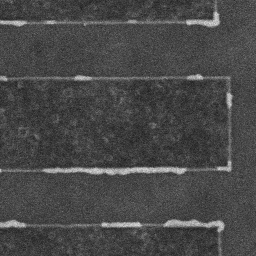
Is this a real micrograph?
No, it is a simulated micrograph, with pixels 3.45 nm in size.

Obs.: one or a few lines or trenches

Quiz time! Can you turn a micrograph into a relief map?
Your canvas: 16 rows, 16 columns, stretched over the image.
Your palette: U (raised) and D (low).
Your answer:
UUUUUUUUUUUUUUDD
UUDDDDDDDDDDUDDD
DDDDDDDDDDDDDDDD
DDDDDDDDDDDDDDDD
DDDDDDDDDDDDDDDD
UUUUUUUUUUUUUUDD
UUUUUUUUUUUUUUDD
UUUUUUUUUUUUUUDD
UUUUUUUUUUUUUUDD
UUUUUUUUUUUUUUDD
UUUUUUUUUUUUUUDD
DDDDDDDDDDDDDDDD
DDDDDDDDDDDDDDDD
DDDDDDDDDDDDDDDD
UUUUUUUUUUUUUUDD
UUUUUUUUUUUUUUDD